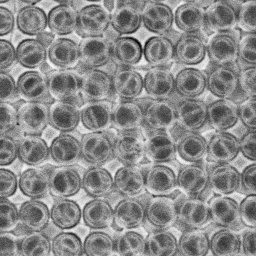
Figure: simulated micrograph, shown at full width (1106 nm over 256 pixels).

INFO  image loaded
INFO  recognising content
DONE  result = a regular array of raised bodies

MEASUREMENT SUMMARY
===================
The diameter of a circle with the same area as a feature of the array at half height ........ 110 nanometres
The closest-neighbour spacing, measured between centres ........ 31.5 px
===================